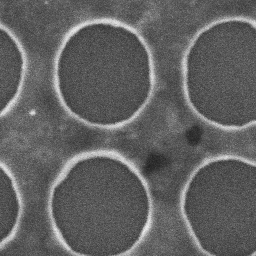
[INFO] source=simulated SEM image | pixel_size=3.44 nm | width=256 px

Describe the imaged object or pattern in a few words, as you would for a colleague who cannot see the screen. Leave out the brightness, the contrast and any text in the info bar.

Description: holes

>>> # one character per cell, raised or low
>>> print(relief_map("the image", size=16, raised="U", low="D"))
UUUUUUUUUUUUUUUU
UUUUUUDUUUUUUUDD
DUUUDDDDDUUUDDDD
DUUUDDDDDUUUDDDD
DUUUDDDDDUUUDDDD
DUUUDDDDDUUUDDDD
DUUUDDDDDUUUDDDD
UUUUUDDDUUUUUDDD
UUUUUUUUUUUUUUUU
UUUUUUUUUUUUUUUU
UUUUDDDDUUUUUDDD
DUUUDDDDDUUUDDDD
DUUDDDDDDUUDDDDD
DUUDDDDDDUUUDDDD
DUUUDDDDDUUUDDDD
UUUUDDDDUUUUUDDD